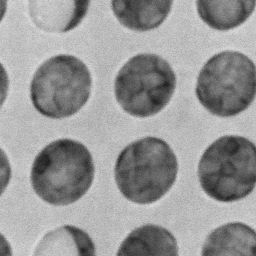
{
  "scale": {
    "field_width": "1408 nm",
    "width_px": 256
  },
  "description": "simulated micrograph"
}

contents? holes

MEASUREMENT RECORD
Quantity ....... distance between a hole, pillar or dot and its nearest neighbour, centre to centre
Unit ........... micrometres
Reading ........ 0.46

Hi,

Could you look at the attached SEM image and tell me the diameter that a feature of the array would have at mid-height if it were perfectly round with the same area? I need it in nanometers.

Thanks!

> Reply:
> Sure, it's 355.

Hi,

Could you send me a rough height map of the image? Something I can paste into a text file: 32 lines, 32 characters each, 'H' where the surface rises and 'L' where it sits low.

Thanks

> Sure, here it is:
LHHHHHHHHLLHHHLLLLLLLLHHHLLHHLLL
LHHHHHHHLLLHHHLLLLLLLHHHHLLHHLLL
HHHHHHHHLLHHHHHLLLLLLHHHHLLLLLLH
HHHHHHHHLHHHHHHHLLLHHHHHHHHLLHHH
HHHHHHHHHHHHHHHHHHHHHHHHHHHHHHHH
HHHHHHHHHHHHHHHHHHHHHHHHHHHHHHHH
HHHHHHHHHHHHHHHHHHHHHHHHHHHHLLHH
HHHHHHLLLLHHHHHHLLLLLHHHHHLLLLLH
LHHHHLLLLLLHHHHLLLLLLLHHHLLLLLLL
LHHHLLLLLLLHHHLLLLLLLLHHHLLLLLLL
LHHHLLLLLLLLHHLLLLLLLLHHHLLLLLLL
LHHHLLLLLLLHHHLLLLLLLLHHHLLLLLLL
LHHHLLLLLLLHHHHLLLLLLHHHHLLLLLLL
HHHHHHLLLLHHHHHLLLLLHHHHHLLLLLLH
HHHHHHLLLHHHHHHHHLLHHHHHHHHLLHHH
HHHHHHHHHHHHHHHHHHHHHHHHHHHHHHHH
HHHHHHHHHHHHHHHHHHHHHHHHHHHHHHHH
HHHHHHHLLHHHHHHHHLLLHHHHHHHLLLLH
HHHHHLLLLLLHHHHHLLLLLHHHHHLLLLLL
LHHHHLLLLLLHHHHLLLLLLLHHHLLLLLLL
LHHHLLLLLLLLHHHHLLLLLLHHHLLLLLLL
LHHHLLHHLLLLHHLLLLLLLLHHHLLLLLLL
LHHHLLLLLLLLHHLLLLLLLLHHHLLLLLLL
LHHHLLLLLLLHHHHLLLLLLHHHHLLLLLLL
HHHHHLLLLLHHHHHLLLLLHHHHHHLLLLLH
HHHHHHLLLHHHHHHHHHHHHHHHHHHHHHHH
HHHHHHHHHHHHHHHHHHHHHHHHHHHHHHHH
HHHHHHHHHHHHHHHHHHHHHHHHHHHHHHHH
HHHHHHHHLLHHHHHHHLLLLHHHHHHLLLLH
LHHHHHHHLLLHHHHHLLLLLLHHHHLLLLLL
LHHHHHHHHLLLHHHLLLLLLLHHHLLLLLLL
LHHHHHHHHLLLHHHLLLLLLLHHHLLLLLLL